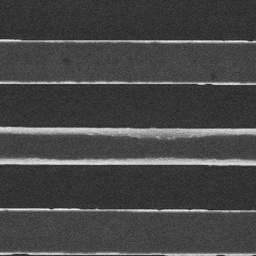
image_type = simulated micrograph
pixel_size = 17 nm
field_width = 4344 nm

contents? lines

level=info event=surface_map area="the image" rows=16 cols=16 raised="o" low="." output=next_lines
................
................
................
oooooooooooooooo
oooooooooooooooo
................
................
................
oooooooooooooooo
oooooooooooooooo
................
................
................
oooooooooooooooo
oooooooooooooooo
oooooooooooooooo